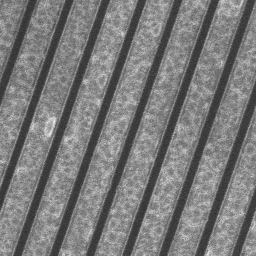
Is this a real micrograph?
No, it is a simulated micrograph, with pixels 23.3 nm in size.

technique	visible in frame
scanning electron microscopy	parallel lines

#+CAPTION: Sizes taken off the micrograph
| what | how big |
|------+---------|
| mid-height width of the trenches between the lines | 0.562 microns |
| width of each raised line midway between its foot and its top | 226 nanometers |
